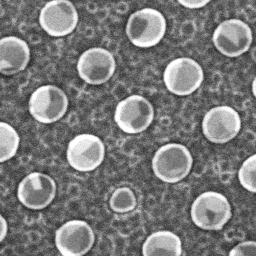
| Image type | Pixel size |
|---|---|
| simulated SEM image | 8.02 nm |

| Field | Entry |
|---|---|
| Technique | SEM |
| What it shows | a regular array of raised bodies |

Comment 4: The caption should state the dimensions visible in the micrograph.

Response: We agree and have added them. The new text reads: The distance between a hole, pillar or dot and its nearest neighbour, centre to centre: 493 nanometers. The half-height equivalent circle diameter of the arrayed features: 0.288 µm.